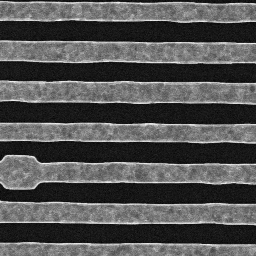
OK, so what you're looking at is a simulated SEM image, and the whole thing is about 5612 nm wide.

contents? wiring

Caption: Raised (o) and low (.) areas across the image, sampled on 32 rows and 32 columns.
oooooooooooooooooooooooooo...oo.
oooooooooooooooooooooooooooooooo
oooooooooooooooooooooooooooooooo
................................
................................
oooooooooooooooooooooooooooooooo
oooooooooooooooooooooooooooooooo
oooooooooooooooooooooooooooooooo
................................
................................
oooooooooooooooooooooooooooooooo
oooooooooooooooooooooooooooooooo
oooooooooooooooooooooooooooooooo
................................
................................
ooooooo..ooooo..................
oooooooooooooooooooooooooooooooo
oooooooooooooooooooooooooooooooo
................................
.oo.............................
ooooooooooooooooooooo....ooo....
oooooooooooooooooooooooooooooooo
oooooooooooooooooooooooooooooooo
.ooo............................
................................
ooooooooooo...............oo....
oooooooooooooooooooooooooooooooo
oooooooooooooooooooooooooooooooo
................................
................................
oooooo..........................
oooooooooooooooooooooooooooooooo